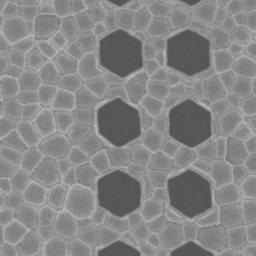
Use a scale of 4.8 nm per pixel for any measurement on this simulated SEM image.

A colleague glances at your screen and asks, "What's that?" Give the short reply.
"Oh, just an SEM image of holes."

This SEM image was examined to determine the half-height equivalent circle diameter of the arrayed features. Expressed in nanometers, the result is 214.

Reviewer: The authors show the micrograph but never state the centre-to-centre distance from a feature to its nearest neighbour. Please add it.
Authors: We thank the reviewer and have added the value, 335 nm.